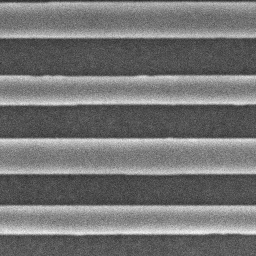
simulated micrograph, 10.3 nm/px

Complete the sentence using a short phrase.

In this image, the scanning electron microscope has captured lines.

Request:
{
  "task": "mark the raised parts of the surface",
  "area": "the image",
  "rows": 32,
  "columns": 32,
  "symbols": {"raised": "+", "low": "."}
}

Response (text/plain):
++++++++++++++++++++++++++++++++
++++++++++++++++++++++++++++++++
++++++++++++++++++++++++++++++++
++++++++++++++++++++++++++++++++
++++++++++++++++++++++++++++++++
................................
................................
................................
................................
................................
++++++++++++++++++++++++++++++++
++++++++++++++++++++++++++++++++
++++++++++++++++++++++++++++++++
................................
................................
................................
................................
++++++++++++++++++++++++++++++++
++++++++++++++++++++++++++++++++
++++++++++++++++++++++++++++++++
++++++++++++++++++++++++++++++++
++++++++++++++++++++++++++++++++
................................
................................
................................
................................
++++++++++++++++++++++++++++++++
++++++++++++++++++++++++++++++++
++++++++++++++++++++++++++++++++
................................
................................
................................